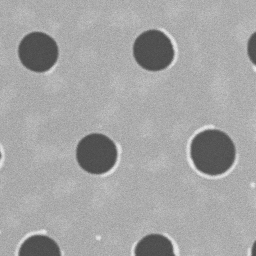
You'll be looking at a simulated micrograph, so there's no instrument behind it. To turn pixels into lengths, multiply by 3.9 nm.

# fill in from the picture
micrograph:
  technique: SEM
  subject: holes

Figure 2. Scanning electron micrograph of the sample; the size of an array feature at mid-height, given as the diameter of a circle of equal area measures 0.161 micrometres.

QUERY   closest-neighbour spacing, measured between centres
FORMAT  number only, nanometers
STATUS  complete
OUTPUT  452